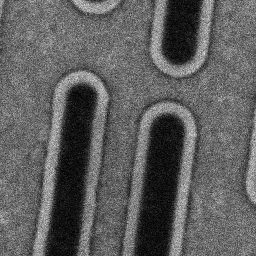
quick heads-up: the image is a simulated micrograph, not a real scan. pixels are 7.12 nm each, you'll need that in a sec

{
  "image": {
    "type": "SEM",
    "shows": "one or a few lines or trenches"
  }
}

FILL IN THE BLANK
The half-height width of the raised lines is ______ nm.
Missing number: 328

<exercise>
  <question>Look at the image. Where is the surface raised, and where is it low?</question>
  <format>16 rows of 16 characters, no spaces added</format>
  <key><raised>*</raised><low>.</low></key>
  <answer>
..........***...
..........***...
..........***...
..........***...
................
....**..........
....**..........
....**...***....
...***...***....
...***...***....
...***...***....
...***...***....
...***..***.....
...***..***.....
...**...***.....
..***...***.....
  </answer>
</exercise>